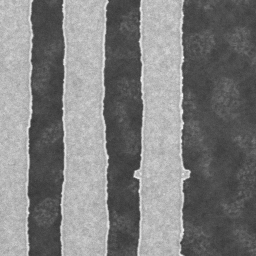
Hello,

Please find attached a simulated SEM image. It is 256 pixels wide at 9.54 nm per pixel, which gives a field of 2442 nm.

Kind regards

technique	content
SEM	one or a few lines or trenches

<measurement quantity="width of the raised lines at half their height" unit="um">0.387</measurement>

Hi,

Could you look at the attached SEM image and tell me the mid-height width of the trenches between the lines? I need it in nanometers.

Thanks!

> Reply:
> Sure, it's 332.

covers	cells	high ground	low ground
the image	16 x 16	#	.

##..###..##.....
##..###..##.....
##..###..##.....
##..###..##.....
##..##...##.....
##..##...##.....
##..##...##.....
##..##...##.....
##..###..##.....
##..###..##.....
##..###..###....
##..###..##.....
##..###..##.....
##..###..##.....
##..###..##.....
##..###..##.....